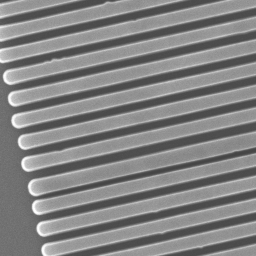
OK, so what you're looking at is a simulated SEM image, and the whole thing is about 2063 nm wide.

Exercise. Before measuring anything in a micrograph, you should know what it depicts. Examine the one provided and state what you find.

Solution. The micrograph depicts parallel lines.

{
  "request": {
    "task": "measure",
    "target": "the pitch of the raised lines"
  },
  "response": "0.179 um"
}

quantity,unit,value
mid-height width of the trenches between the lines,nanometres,67.9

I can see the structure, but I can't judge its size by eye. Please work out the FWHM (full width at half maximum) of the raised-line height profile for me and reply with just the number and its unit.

0.113 µm